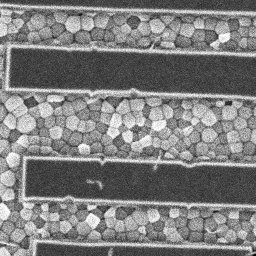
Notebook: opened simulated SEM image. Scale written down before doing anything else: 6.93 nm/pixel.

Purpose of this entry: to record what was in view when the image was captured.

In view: one or a few lines or trenches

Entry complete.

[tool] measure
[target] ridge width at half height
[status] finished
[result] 0.289 um